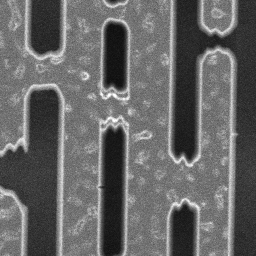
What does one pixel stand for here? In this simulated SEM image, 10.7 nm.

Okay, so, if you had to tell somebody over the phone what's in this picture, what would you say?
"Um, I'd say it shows one or a few lines or trenches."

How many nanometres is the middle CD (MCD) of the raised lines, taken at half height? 461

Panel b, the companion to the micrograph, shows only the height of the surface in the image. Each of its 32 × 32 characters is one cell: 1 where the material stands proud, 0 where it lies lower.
11110000111111111111110001111000
11110000111111111111110001111000
11110000111111111111110001111000
11110000111110001111110001111000
11110000111110001111110000000000
11110000111110001111110000000000
11110001111110001111110000111000
11111111111110001111110001111000
11111111111110001111110001111000
11111111111110001111110001111000
11111111111110001111110001111000
11110001111111111111110001111000
11100000111111111111110001111000
11100000111111111111110001111000
11100000111111111111110001111000
11100000111111111111110001111000
11100000111110011111110001111000
11100000111110001111110001111000
10000000111110001111110001111000
00000000111110001111110011111000
00000000111110001111111111111000
00000001111110001111111111111000
00000001111110001111111111111000
00000001111110001111111111111000
11000001111110011111111111111000
11100001111110011111111111111000
11100001111110011111100011111000
11100001111110011111100011111000
11100001111110011111100011111000
11100001111110011111100011111000
11100001111110011111100011111000
11100001111110011111100011111000